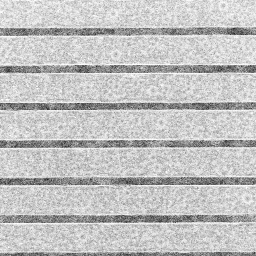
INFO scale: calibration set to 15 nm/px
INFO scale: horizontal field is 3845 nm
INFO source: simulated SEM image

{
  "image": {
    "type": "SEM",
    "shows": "parallel lines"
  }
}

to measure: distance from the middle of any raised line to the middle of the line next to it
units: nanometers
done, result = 557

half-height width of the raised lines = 430 nm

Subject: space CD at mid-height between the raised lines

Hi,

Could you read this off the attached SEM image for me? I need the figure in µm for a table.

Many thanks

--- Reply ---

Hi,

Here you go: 0.133